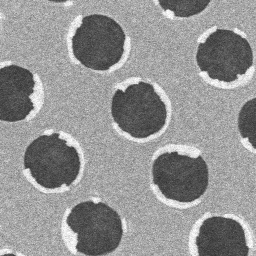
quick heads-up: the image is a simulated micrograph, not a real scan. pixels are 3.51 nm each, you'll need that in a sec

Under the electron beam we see holes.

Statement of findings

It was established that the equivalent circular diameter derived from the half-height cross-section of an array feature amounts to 188 nm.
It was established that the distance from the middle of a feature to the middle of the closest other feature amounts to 277 nanometers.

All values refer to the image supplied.